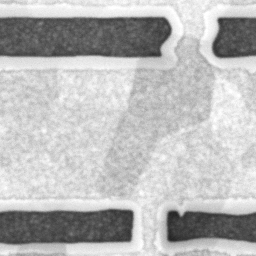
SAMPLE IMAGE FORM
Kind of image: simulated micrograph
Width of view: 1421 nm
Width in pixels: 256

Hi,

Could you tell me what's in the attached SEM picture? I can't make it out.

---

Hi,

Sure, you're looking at one or a few lines or trenches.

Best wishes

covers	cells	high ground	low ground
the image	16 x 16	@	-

@@@@@@@@@@@@@@@@
-----------@@---
-----------@@---
----------@@@---
@@@@@@@@@@@@@@@@
@@@@@@@@@@@@@@@@
@@@@@@@@@@@@@@@@
@@@@@@@@@@@@@@@@
@@@@@@@@@@@@@@@@
@@@@@@@@@@@@@@@@
@@@@@@@@@@@@@@@@
@@@@@@@@@@@@@@@@
@@@@@@@@@@@@@@@@
---------@------
--------@@------
-------@@@@@@@@@